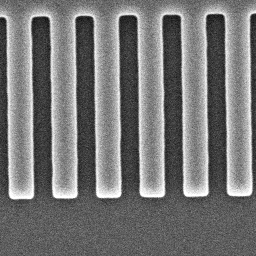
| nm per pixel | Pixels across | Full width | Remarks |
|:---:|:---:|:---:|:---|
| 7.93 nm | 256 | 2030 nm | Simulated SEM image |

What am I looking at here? groups of lines, slits or small figures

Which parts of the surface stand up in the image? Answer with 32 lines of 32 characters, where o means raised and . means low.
oooooooooooooooooooooooooooooooo
oooooooooooooooooooooooooooooooo
.ooo..ooo...ooo..ooo...ooo..ooo.
.ooo..ooo...ooo..ooo...ooo..ooo.
.ooo..ooo...ooo..ooo...ooo..ooo.
.ooo..ooo...ooo..ooo...ooo..ooo.
.ooo..ooo...ooo..ooo...ooo..ooo.
.ooo..ooo...ooo..ooo...ooo..ooo.
.ooo..ooo...ooo..ooo...ooo..ooo.
.ooo..ooo...ooo..ooo...ooo..ooo.
.ooo..ooo...ooo..ooo...ooo..ooo.
.ooo...oo...ooo..ooo...ooo..ooo.
.ooo...oo...ooo...oo...ooo..ooo.
.ooo...oo...ooo...oo...ooo..ooo.
.ooo...oo...ooo...oo...ooo..ooo.
.ooo...oo...ooo...oo...ooo..ooo.
.ooo...oo...ooo...oo...ooo..ooo.
.ooo...oo...ooo...oo...ooo..ooo.
.ooo...oo...ooo...oo...ooo..ooo.
.ooo...ooo..ooo...oo...ooo..ooo.
.ooo...ooo..ooo...oo...ooo..ooo.
.ooo...oo...ooo...oo...ooo..ooo.
.ooo...oo...ooo...oo...ooo..ooo.
.ooo...oo...ooo...oo...ooo..ooo.
.ooo...oo....oo.................
................................
................................
................................
................................
................................
................................
................................